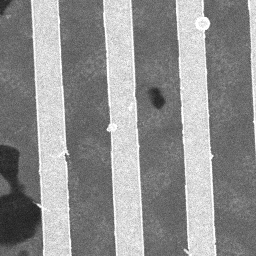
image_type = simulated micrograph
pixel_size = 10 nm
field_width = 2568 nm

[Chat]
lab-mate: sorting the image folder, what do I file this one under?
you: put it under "one or a few lines or trenches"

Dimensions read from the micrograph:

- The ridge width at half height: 26 px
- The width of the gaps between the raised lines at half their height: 463 nm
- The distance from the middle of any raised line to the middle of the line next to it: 725 nanometers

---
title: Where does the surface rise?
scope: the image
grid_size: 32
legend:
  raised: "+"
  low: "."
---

....+++......+++......+++......+
....+++......+++......+++......+
....+++......+++......++++.....+
....+++......+++......++++.....+
....+++......+++......++++.....+
....+++......++++.....++++.....+
....++++.....++++.....++++.....+
....++++.....++++.....++++.....+
....++++......+++......+++.....+
.....+++......+++......+++......
.....+++......+++......+++......
.....+++......+++......+++......
.....+++......+++......+++......
.....+++......+++......+++......
.....+++......+++......+++......
.....+++......+++......+++......
.....+++......+++......+++......
.....+++......+++......+++......
.....+++......+++......+++......
.....+++......+++......+++......
.....+++......+++......+++......
.....+++......+++......+++......
.....+++......+++......+++......
.....++++.....+++......+++......
.....+++......+++......++++.....
.....++++.....++++.....++++.....
.....++++.....++++.....++++.....
.....++++.....++++......+++.....
.....++++.....++++.....++++.....
......+++.....++++.....++++.....
......+++......+++......+++.....
......+++......+++.....++++.....